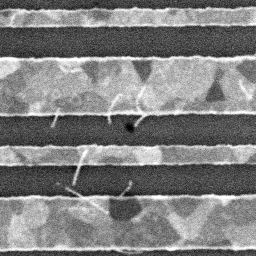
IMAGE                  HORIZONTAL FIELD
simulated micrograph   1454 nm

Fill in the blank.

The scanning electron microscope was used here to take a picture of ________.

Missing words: lines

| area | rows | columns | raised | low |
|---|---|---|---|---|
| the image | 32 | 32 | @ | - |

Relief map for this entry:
--------------------------------
@@@@@@@@@@@@@@@@@@@@@@@@@@@@@@@@
@@@@@@@@@@@@@@@@@@@@@@@@@@@@@@@@
--------------------------------
--------------------------------
--------------------------------
--------------------------------
@@@@@@@@@@@@@@@@@@@@@@@@@@@@@@@@
@@@@@@@@@@@@@@@@@@@@@@@@@@@@@@@@
@@@@@@@@@@@@@@@@@@@@@@@@@@@@@@@@
@@@@@@@@@@@@@@@@@@@@@@@@@@@@@@@@
@@@@@@@@@@@@@@@@@@@@@@@@@@@@@@@@
@@@@@@@@@@@@@@@@@@@@@@@@@@@@@@@@
@@@@@@@@@@@@@@@@@@@@@@@@@@@@@@@@
--------------------------------
--------------------------------
--------------------------------
--------------------------------
@@@@@@@@@@@@@@@@@@@@@@@@@@@@@@@@
@@@@@@@@@@@@@@@@@@@@@@@@@@@@@@@@
@@@@@@@@@@@@@-@@@@---@@---------
--------------------------------
--------------------------------
--------------------------------
----------------------@@-@@---@@
@@@@@@@@@@@@@@@@@@@@@@@@@@@@@@@@
@@@@@@@@@@@@@@@@@@@@@@@@@@@@@@@@
@@@@@@@@@@@@@@@@@@@@@@@@@@@@@@@@
@@@@@@@@@@@@@@@@@@@@@@@@@@@@@@@@
@@@@@@@@@@@@@@@@@@@@@@@@@@@@@@@@
@@@@@@@@@@@@@@@@@@@@@@@@@@@@@@@@
--------------------------------